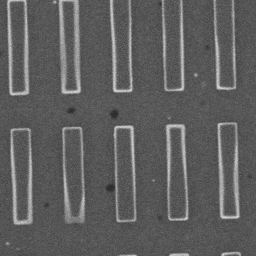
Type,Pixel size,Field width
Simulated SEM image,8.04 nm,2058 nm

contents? groups of lines, slits or small figures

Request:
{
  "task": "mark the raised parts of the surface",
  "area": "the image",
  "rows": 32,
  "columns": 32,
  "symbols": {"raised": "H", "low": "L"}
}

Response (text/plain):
LHHLLLLLHHLLLLHHLLLLHHHLLLLHHLLL
LHHLLLLLHHLLLLHHLLLLHHHLLLLHHLLL
LHHLLLLLHHLLLLHHLLLLHHHLLLLHHLLL
LHHLLLLLHHLLLLHHLLLLLHHLLLLHHLLL
LHHLLLLLHHLLLLHHLLLLLHHLLLLHHLLL
LHHLLLLLHHLLLLHHLLLLLHHLLLLHHLLL
LHHLLLLLHHLLLLHHLLLLLHHLLLLHHLLL
LHHLLLLLHHLLLLHHLLLLLHHLLLLHHLLL
LHHLLLLLHHLLLLHHLLLLLHHLLLLHHLLL
LHHLLLLLHHLLLLHHLLLLLHHLLLLHHLLL
LHHLLLLLHHLLLLHHLLLLLHHLLLLHHLLL
LLHLLLLLLLLLLLLLLLLLLLLLLLLLLLLL
LLLLLLLLLLLLLLLLLLLLLLLLLLLLLLLL
LLLLLLLLLLLLLLLLLLLLLLLLLLLLLLLL
LLLLLLLLLLLLLLLLLLLLLLLLLLLLLLLL
LLLLLLLLLLLLLLLLLLLLLLLLLLLLHLLL
LLHHLLLLHHLLLLHHHLLLLHHLLLLHHHLL
LLHHLLLLHHLLLLHHHLLLLHHLLLLHHHLL
LLHHLLLLHHLLLLHHHLLLLHHLLLLHHHLL
LLHHLLLLHHLLLLHHHLLLLHHLLLLHHHLL
LLHHLLLLHHLLLLHHHLLLLHHLLLLHHHLL
LLHHLLLLHHLLLLHHHLLLLHHLLLLLHHLL
LLHHLLLLHHLLLLHHHLLLLHHLLLLLHHLL
LLHHLLLLHHLLLLHHHLLLLHHLLLLLHHLL
LLHHLLLLHHLLLLLHHLLLLHHLLLLLHHLL
LLHHLLLLHHLLLLLHHLLLLHHLLLLLHHLL
LLHHLLLLHHLLLLLHHLLLLHHLLLLLHHLL
LLHHLLLLLLLLLLLHHLLLLLLLLLLLLLLL
LLLLLLLLLLLLLLLLLLLLLLLLLLLLLLLL
LLLLLLLLLLLLLLLLLLLLLLLLLLLLLLLL
LLLLLLLLLLLLLLLLLLLLLLLLLLLLLLLL
LLLLLLLLLLLLLLLLLLLLLLLLLLLLLLLL